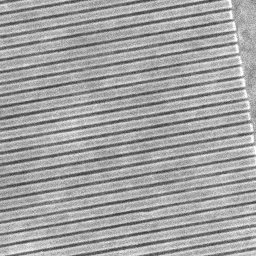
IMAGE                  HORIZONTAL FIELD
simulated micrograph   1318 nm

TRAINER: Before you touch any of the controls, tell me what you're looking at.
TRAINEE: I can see parallel lines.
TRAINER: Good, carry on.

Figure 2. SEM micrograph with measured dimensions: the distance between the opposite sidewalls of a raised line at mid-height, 40.6 nm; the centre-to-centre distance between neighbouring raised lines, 58.9 nanometers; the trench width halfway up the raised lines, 17.8 nanometers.